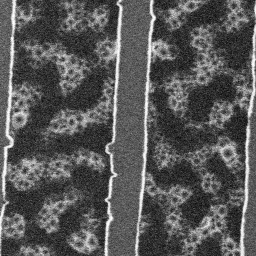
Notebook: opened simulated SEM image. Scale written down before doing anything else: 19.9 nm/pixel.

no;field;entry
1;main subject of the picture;one or a few lines or trenches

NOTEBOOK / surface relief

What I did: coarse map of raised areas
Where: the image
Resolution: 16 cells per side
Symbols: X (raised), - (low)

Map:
-XXXXXX--XXXXXXX
-XXXXXX---XXXXXX
-XXXXXX--XXXXXXX
-XXXXXX--XXXXXXX
-XXXXXX--XXXXXXX
-XXXXXX--XXXXXXX
-XXXXXX--XXXXXXX
-XXXXXX--XXXXXXX
-XXXXXX--XXXXXX-
XXXXXXX--XXXXXX-
XXXXXXX--XXXXXX-
XXXXXXX--XXXXXX-
XXXXXXX--XXXXXX-
XXXXXXX--XXXXXX-
XXXXXXX--XXXXXX-
XXXXXXX--XXXXXX-